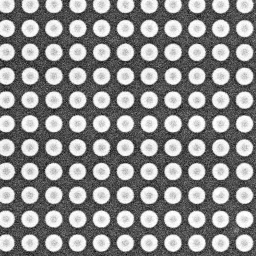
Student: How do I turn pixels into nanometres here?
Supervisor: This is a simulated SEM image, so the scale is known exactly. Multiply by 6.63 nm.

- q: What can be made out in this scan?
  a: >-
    an array of small figures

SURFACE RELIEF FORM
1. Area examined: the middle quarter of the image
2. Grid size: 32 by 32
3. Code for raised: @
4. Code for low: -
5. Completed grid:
--------------------------------
--@@@---@@@---@@@---@@@---@@@---
-@@@@--@@@@--@@@@--@@@@--@@@@--@
-@@@@--@@@@--@@@@--@@@@--@@@@--@
--@@@---@@@---@@@---@@@---@@@---
--------------------------------
--------------------------------
--@@@---@@@---@@@---@@@---@@@---
--@@@--@@@@--@@@@--@@@@--@@@@--@
--@@@--@@@@--@@@@--@@@@--@@@@--@
--@@@---@@@---@@@---@@@---@@@---
--------------------------------
--------------------------------
--@@@---@@@---@@@---@@@---@@@---
--@@@--@@@@--@@@@--@@@@--@@@@--@
--@@@--@@@@--@@@@--@@@@--@@@@--@
--@@@---@@@---@@@---@@@---@@@---
--------------------------------
--------------------------------
--@@@---@@@---@@@---@@@---@@@---
--@@@--@@@@--@@@@--@@@@--@@@@--@
--@@@--@@@@--@@@@--@@@@--@@@@--@
--@@----@@@---@@----@@@---@@@---
--------------------------------
--------------------------------
--@@@---@@@---@@@---@@@---@@@---
-@@@@--@@@@--@@@@--@@@@--@@@@--@
-@@@@--@@@@--@@@@--@@@@--@@@@--@
--@@@---@@@---@@@---@@----@@----
--------------------------------
--------------------------------
--@@@---@@@---@@@---@@@---@@@---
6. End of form